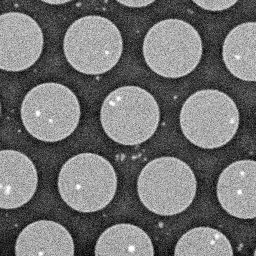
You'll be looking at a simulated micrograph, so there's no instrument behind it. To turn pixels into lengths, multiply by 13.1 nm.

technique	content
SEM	an array of small figures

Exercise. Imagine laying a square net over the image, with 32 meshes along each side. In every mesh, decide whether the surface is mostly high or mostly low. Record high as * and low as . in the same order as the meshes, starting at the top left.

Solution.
...............***.......****...
................................
****......***........*..........
*****....******....*****.....***
*****...*******...*******...****
*****...*******...*******...****
*****...*******...*******...****
****.....******...*******...****
***......*****.....*****.....***
.....................**.......**
......*.........................
....*****.....****.......**.....
...*******...******....******...
...*******...*******...*******..
...*******...*******...*******..
...*******...*******...*******..
....*****....******....******...
.....**.......****......*****...
................................
***.......**....................
****....******.....****......***
****....******....******....****
*****..*******...*******...*****
****...*******...*******...*****
****....******...*******...*****
***......****.....******....****
...................***.......***
................................
...*****......***........*......
..*******....*****.....*****....
..*******...*******...*******...
..*******...*******...*******...